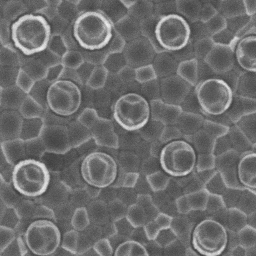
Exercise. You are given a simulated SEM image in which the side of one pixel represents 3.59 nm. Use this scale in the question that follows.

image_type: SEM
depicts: a regular array of raised bodies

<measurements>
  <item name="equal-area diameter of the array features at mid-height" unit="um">0.123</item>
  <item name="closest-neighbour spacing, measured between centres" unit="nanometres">221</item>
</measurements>